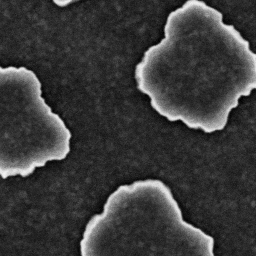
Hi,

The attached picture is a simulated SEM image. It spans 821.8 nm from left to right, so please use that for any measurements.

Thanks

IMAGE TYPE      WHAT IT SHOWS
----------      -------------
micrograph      raised bodies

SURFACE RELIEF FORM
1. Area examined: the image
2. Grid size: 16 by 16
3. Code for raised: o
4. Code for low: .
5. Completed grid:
...........oo...
..........oooo..
..........ooooo.
.........ooooooo
oo.......ooooooo
ooo......ooooooo
ooo.......ooooo.
oooo.......ooo..
oooo............
oooo............
oo..............
.........o......
.......oooo.....
......ooooo.....
.....oooooooo...
.....oooooooo...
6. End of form